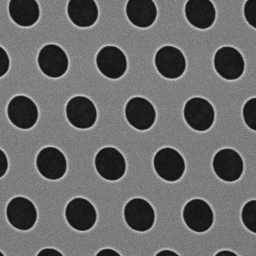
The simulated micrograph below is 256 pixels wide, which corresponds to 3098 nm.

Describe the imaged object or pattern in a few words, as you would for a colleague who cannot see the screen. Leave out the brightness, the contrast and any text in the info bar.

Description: a regular array of holes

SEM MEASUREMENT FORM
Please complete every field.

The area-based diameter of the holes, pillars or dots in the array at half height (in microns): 0.384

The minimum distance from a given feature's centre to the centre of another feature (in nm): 709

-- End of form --